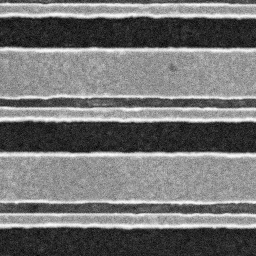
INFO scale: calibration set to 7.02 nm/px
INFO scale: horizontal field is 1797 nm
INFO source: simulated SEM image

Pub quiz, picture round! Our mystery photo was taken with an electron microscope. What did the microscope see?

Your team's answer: lines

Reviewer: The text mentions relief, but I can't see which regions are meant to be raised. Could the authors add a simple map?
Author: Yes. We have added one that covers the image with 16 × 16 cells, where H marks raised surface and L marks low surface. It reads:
HHHHHHHHHHHHHHHH
LLLLLLLLLLLLLLLL
LLLLLLLLLLLLLLLL
HHHHHHHHHHHHHHHH
HHHHHHHHHHHHHHHH
HHHHHHHHHHHHHHHH
HHHHHHHHHHHHHHHH
HLLHHHHHHHHHHHHH
LLLLLLLLLLLLLLLL
LLLLLLLLLLLLLLLL
HHHHHHHHHHHHHHHH
HHHHHHHHHHHHHHHH
HHHHHHHHHHHHHHHH
HHHHHHHHHHHHHHHH
LLLLLLLLLLLLLLLL
LLLLLLLLLLLLLLLL